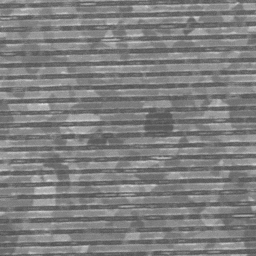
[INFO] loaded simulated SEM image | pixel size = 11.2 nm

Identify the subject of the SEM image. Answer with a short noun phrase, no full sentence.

parallel lines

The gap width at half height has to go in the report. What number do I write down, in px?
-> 5.25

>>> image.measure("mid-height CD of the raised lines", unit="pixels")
6.63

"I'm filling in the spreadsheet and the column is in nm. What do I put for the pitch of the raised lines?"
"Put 133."